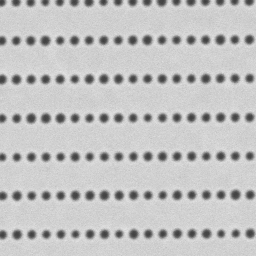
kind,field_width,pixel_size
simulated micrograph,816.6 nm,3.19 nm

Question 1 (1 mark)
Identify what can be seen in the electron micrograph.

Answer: a regular array of holes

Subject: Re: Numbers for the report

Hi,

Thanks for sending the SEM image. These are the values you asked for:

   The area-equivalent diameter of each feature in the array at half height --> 30.6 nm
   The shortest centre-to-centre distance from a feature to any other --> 45.7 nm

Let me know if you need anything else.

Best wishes